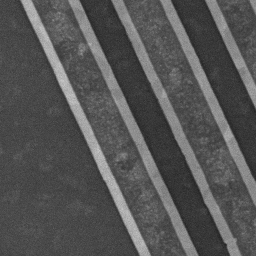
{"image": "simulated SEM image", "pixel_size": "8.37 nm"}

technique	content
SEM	one or a few lines or trenches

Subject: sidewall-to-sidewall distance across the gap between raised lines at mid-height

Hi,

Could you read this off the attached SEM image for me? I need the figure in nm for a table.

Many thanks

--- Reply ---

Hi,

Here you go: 338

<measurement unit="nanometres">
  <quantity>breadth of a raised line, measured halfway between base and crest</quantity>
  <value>353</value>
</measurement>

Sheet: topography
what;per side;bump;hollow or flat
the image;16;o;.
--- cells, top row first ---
..ooo...ooo..ooo
..ooo...ooo...oo
...ooo...oo...oo
...ooo...ooo...o
....ooo..ooo...o
....ooo...ooo...
.....ooo..ooo...
.....ooo...ooo..
......ooo..ooo..
......ooo...ooo.
.......oo...ooo.
.......ooo...ooo
.......ooo...ooo
........ooo...oo
........ooo...oo
.........ooo...o